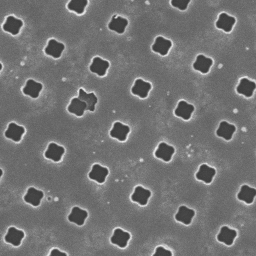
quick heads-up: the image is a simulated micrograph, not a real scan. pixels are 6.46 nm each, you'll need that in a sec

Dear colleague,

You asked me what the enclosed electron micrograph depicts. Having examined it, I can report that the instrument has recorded a regular array of holes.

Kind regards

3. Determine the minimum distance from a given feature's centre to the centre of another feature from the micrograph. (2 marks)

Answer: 300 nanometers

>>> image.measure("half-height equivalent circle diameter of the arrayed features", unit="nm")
114